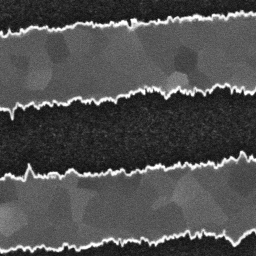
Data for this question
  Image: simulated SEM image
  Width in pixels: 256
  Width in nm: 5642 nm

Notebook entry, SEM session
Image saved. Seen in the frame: one or a few lines or trenches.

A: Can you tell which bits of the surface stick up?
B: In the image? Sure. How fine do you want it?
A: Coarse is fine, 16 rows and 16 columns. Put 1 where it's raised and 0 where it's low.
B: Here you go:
0000000000000000
0000010111111111
1111111111111111
1111111111111111
1111111111111111
1111111111111111
1110000000000000
0000000000000000
0000000000000000
0000000000000000
0000000001111111
1111111111111111
1111111111111111
1111111111111111
1111111111111111
1111000000000000